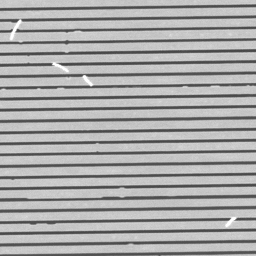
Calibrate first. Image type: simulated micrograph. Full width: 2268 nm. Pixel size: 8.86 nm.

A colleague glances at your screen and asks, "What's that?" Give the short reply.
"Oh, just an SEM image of parallel lines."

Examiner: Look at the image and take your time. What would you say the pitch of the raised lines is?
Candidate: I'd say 99.4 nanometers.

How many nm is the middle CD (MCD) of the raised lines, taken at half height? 70.9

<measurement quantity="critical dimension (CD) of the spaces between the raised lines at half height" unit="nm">26.6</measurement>